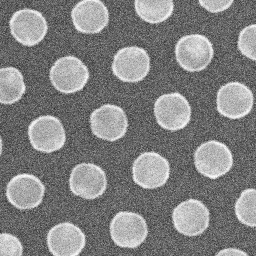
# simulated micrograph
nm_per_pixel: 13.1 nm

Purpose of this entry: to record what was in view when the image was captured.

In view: a regular array of raised bodies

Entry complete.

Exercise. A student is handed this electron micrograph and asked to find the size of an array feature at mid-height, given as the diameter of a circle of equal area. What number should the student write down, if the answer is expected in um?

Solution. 0.452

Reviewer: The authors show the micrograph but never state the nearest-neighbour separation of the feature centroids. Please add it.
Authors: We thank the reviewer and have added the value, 816 nm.